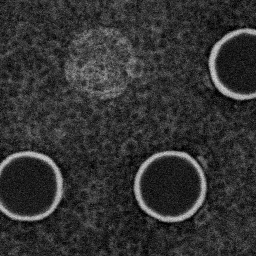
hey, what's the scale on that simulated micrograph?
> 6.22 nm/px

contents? raised bodies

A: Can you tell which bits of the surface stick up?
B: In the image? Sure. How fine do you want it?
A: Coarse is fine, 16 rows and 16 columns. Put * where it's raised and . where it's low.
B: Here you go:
................
................
..............**
.............***
.............***
..............**
................
................
................
................
***......***....
****.....****...
****.....****...
.**.......**....
................
................